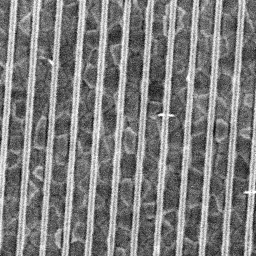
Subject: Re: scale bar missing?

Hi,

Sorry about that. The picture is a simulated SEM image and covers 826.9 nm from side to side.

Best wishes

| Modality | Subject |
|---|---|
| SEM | parallel lines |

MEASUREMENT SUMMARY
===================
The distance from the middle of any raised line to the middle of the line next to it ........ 22.7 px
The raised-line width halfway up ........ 16.5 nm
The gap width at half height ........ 17.3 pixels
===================